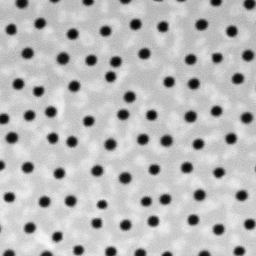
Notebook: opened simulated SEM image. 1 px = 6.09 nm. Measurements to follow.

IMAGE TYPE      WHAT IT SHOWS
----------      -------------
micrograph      a regular array of holes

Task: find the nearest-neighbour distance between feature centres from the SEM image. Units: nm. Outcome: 160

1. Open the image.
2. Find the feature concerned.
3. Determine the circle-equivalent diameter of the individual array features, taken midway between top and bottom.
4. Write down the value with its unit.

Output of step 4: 12.1 px